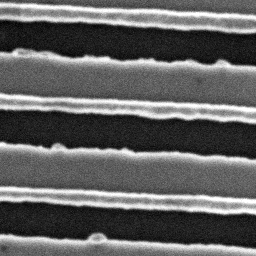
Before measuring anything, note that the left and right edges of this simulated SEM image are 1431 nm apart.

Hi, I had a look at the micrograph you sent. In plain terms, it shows lines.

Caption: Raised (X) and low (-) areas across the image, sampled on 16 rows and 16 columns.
XXXXXXXXXXXXXXXX
-------XXXXXXXXX
----------------
XXXX------------
XXXXXXXXXXXXXXXX
XXXXXXXXXXXXXXXX
XXXXXXXXXXXXXXXX
-------------XXX
----------------
XXXXXXXX--------
XXXXXXXXXXXXXXXX
XXXXXXXXXXXXXXXX
XXXXXXXXXXXXXXXX
----------------
----------------
XXXXXXXXXXXXXXX-